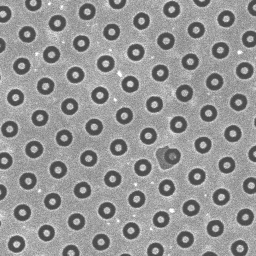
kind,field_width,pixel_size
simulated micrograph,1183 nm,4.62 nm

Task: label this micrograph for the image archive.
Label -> a regular array of ring-shaped grooves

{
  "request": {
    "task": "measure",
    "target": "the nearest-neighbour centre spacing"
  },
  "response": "146 nm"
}